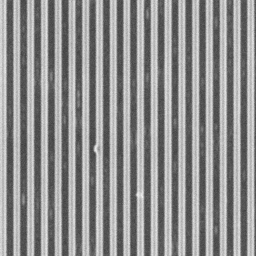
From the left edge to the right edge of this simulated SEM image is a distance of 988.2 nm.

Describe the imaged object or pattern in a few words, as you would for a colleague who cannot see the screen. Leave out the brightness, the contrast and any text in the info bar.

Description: parallel lines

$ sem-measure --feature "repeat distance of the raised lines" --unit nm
53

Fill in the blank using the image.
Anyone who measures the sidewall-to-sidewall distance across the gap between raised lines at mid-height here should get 28.4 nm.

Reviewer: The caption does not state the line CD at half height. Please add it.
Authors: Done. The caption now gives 21.2 nm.